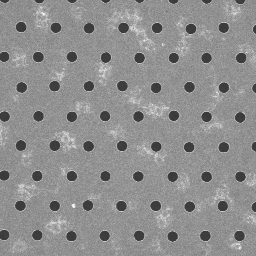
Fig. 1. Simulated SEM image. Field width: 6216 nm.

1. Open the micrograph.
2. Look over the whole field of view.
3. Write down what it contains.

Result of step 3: a regular array of holes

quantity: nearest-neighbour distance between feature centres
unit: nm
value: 808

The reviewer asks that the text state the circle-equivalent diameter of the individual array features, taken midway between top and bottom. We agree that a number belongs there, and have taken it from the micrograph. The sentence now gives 0.257 microns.